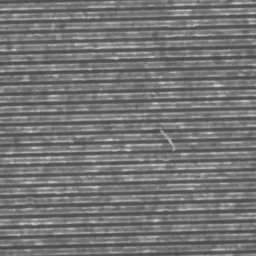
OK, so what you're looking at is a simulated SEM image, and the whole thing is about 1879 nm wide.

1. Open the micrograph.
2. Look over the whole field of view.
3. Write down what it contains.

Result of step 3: parallel lines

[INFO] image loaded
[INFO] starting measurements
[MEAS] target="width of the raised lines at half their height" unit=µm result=0.0468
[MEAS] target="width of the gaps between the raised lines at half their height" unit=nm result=27.5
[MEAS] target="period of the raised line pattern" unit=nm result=75.2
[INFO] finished